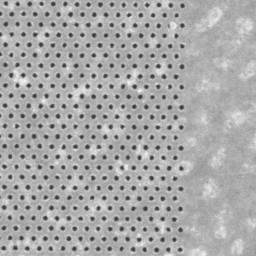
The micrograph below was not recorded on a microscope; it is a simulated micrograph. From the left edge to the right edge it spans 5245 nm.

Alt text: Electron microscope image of a regular array of holes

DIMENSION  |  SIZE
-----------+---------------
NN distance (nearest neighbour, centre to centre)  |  0.232 µm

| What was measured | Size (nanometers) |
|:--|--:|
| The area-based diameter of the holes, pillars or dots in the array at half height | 106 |